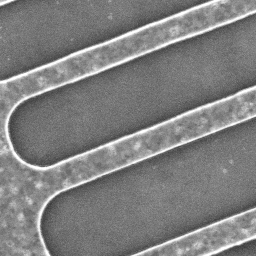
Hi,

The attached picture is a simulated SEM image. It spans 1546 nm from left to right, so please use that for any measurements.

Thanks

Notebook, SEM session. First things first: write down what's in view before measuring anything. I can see one or a few lines or trenches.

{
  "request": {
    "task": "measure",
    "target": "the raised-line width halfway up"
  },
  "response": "156 nm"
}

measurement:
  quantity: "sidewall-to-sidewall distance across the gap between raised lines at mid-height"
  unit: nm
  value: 435